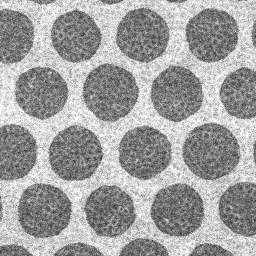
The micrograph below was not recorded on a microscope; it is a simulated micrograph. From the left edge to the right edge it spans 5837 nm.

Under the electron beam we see a regular array of holes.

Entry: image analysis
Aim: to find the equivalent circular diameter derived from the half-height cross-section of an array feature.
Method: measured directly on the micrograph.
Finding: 1240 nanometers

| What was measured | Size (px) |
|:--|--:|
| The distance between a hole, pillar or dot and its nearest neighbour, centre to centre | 66.1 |